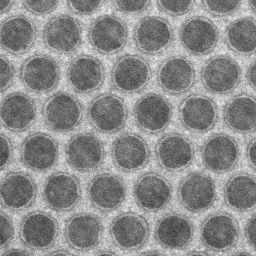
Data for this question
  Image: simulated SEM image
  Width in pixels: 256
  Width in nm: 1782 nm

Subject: a regular array of raised bodies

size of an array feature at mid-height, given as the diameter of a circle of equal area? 35 pixels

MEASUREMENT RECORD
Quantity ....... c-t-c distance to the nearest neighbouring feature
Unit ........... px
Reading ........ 44.7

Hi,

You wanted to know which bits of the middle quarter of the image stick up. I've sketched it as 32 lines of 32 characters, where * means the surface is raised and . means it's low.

..*******....********....*******
.********....********...********
.*********..*********...********
.*********...********...********
..*******....*******....********
..*******....*******.....******.
....**.........***........****..
................................
**.......****.......****.......*
***....*******.....*******....**
****...********...********...***
****..*********...********...***
****..*********...********...***
****...********...********....**
***....********...********....**
***.....******.....******......*
.........****........***........
................................
...*****......****.......*****..
..*******....*******....*******.
.********....*******....********
.*********..*********..*********
.********...*********..*********
.********....********...********
..*******....*******....*******.
..******......*****......*****..
............*...*...............
................................
**......*****.......****.......*
***....*******.....******.....**
***....********...********...***
****..*********...********...***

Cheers